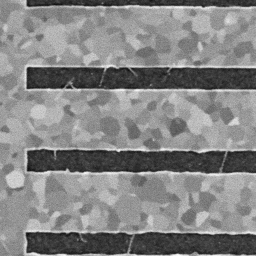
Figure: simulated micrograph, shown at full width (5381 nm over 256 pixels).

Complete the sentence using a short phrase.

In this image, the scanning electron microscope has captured one or a few lines or trenches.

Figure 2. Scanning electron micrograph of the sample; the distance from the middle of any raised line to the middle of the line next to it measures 1740 nm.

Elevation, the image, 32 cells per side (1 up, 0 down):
11100000000000000000000000000000
11111111111111111111111111111111
11111111111111111111111111111111
11111111111111111111111111111111
11111111111111111111111111111111
11111111111111111111111111111111
11111111111111111111111111111111
11111111111111111111111111111111
11100000000000000000000000000000
11100000000000000000000000000000
11100000000000000000000000000000
11111111111111111111111111111111
11111111111111111111111111111111
11111111111111111111111111111111
11111111111111111111111111111111
11111111111111111111111111111111
11111111111111111111111111111111
11111111111111111111111111111111
11111111111111111111111111111111
11100000000000000000000000000000
11100000000000000000000000000000
11110011100000000000100000000000
11111111111111111111111111111111
11111111111111111111111111111111
11111111111111111111111111111111
11111111111111111111111111111111
11111111111111111111111111111111
11111111111111111111111111111111
11111111111111111111111111111111
11100000000000000000000000000000
11100000000000000000000000000000
11100000000000000000000000000000